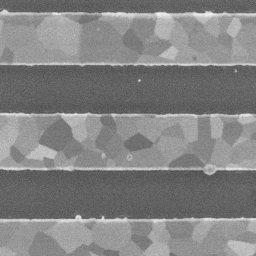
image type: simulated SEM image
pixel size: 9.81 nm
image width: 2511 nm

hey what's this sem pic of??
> lines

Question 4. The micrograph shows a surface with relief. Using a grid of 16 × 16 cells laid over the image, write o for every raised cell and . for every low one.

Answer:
................
oooooooooooooooo
oooooooooooooooo
oooooooooooooooo
................
................
................
oooooooooooooooo
oooooooooooooooo
oooooooooooooooo
oooooooooooooooo
................
................
................
oooooooooooooooo
oooooooooooooooo